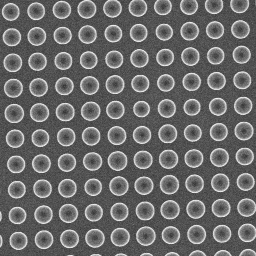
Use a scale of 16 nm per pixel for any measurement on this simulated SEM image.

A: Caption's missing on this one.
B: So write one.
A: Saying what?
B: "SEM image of an array of small figures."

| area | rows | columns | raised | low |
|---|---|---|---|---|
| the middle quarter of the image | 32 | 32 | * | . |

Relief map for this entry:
**...***...***....**............
................................
...............................*
*....***...***...****...***...**
**..****...****..****..*****..**
**..*****..****..****..****...**
**..****...****...***...***....*
*.....*.........................
................................
............**....**....***...**
**...****..****..****...****..**
**..*****..****..****...****..**
**..*****..****...***...***....*
**...***....**..................
................................
.........................**....*
**...***...****...***...****..**
***..****..****..*****..****..**
***..****..****..*****..****..**
**...****...***...***....**.....
*...............................
................................
*.....**....***...***...****..**
***..****..*****..****..****..**
***..****..*****..****..****..**
***..****..****...***....***...*
**....*......*..................
................................
............***....**....***...*
***...***...****..****..*****..*
***..****..*****..****..*****..*
***..****...****..****..****...*